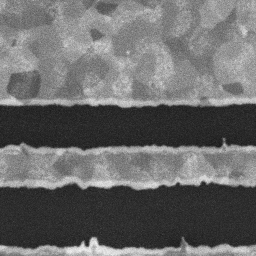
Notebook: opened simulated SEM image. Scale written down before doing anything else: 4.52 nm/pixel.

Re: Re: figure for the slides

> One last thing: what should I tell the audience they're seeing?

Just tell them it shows one or a few lines or trenches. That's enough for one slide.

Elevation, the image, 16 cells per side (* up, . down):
****************
****************
****************
****************
****************
****************
................
................
................
****************
****************
*..*.**.**......
................
................
................
.....*.....*....